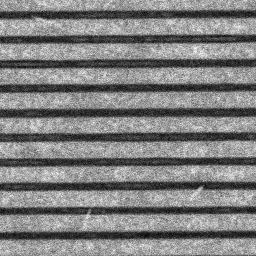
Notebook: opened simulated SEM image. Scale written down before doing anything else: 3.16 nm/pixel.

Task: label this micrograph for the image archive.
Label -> parallel lines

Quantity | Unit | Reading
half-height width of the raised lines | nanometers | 48.6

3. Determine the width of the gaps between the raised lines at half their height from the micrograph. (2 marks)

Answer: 28.5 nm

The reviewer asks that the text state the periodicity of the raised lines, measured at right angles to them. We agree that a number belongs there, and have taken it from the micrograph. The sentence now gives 77.5 nanometres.